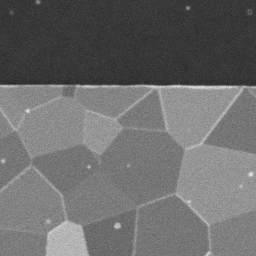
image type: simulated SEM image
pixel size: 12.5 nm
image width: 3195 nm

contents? wiring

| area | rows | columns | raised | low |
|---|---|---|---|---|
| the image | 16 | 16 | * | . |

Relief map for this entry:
................
................
................
................
................
****************
****************
****************
****************
****************
****************
****************
****************
****************
****************
****************